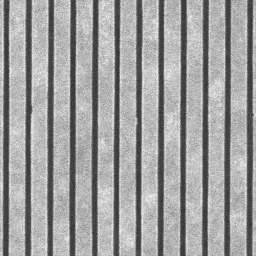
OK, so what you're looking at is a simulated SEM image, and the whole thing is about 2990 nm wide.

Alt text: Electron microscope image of parallel lines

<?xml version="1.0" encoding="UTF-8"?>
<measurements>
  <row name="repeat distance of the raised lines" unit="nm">259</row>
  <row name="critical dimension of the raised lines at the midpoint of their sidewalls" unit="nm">194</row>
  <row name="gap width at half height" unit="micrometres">0.0672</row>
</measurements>